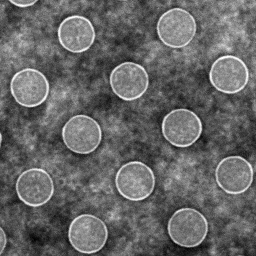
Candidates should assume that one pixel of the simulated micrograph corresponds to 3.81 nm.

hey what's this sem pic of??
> a regular array of raised bodies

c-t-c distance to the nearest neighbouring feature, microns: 0.268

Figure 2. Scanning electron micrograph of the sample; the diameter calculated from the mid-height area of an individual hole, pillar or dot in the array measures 141 nanometers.